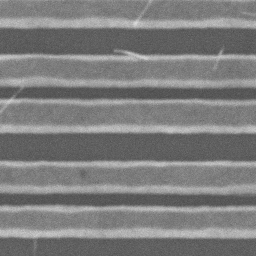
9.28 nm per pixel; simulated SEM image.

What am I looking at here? lines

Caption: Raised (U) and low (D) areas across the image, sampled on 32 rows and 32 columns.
UUUUUUUUUUUUUUUUUUUUUUUUUUUUUUUU
UUUUUUUUUUUUUUUUUUUUUUUUUUUUUUUU
UUUUUUUUUUUUUUUUUUUUUUUUUUUUUUUU
DDDDDDDDDDDDDDDDDDDDDDDDDDDDDDDD
DDDDDDDDDDDDDDDDDDDDDDDDDDDDDDDD
DDDDDDDDDDDDDDDDDDDDDDDDDDDDDDDD
DDDDDDDDDDDDDDDDDDDDDDDDDDDDDDDD
UUUUUUUUUUUUUUUUUUUUUUUUUUUUUUUU
UUUUUUUUUUUUUUUUUUUUUUUUUUUUUUUU
UUUUUUUUUUUUUUUUUUUUUUUUUUUUUUUU
UUUUDDDUUUUUUUUUUUUUUUUUUUUUUUUU
DDDDDDDDDDDDDDDDDDDDDDDDDDDDDDDD
DUUUDDDDDDDDDDDDDDDDDDDDDDDDDDDD
UUUUUUUUUUUUUUUUUUUUUUUUUUUUUUUU
UUUUUUUUUUUUUUUUUUUUUUUUUUUUUUUU
UUUUUUUUUUUUUUUUUUUUUUUUUUUUUUUU
DDDDDDDDDDDDDDDDDDDDDDDDDDDDDDDD
DDDDDDDDDDDDDDDDDDDDDDDDDDDDDDDD
DDDDDDDDDDDDDDDDDDDDDDDDDDDDDDDD
DDDDDDDDDDDDDDDDDDDDDDDDDDDDDDDD
UUUUUUUUUUUUUUUUUUUUUUUUUUUUUUUU
UUUUUUUUUUUUUUUUUUUUUUUUUUUUUUUU
UUUUUUUUUUUUUUUUUUUUUUUUUUUUUUUU
UUUUUUUUUUUUUUUUUUUUUUUUUUUUUUUU
DDDDDDDDDDDDDDDDDDDDDDDDDDDDDDDD
DDDDDDDDDDDDDDDDDDDDDDDDDDDDDDDD
UUUUUUUUUUUUUUUUUUUUUUUUUUUUUUUU
UUUUUUUUUUUUUUUUUUUUUUUUUUUUUUUU
UUUUUUUUUUUUUUUUUUUUUUUUUUUUUUUU
DDDDDDDDDDDDDDDDDDDDDDDDDDDDDDDD
DDDDDDDDDDDDDDDDDDDDDDDDDDDDDDDD
DDDDDDDDDDDDDDDDDDDDDDDDDDDDDDDD